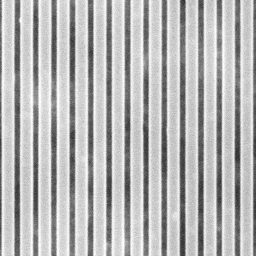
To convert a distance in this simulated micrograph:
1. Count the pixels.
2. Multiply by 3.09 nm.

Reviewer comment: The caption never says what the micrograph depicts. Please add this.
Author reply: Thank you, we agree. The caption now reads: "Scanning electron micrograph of parallel lines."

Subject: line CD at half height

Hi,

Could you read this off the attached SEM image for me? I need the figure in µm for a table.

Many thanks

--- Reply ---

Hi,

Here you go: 0.0355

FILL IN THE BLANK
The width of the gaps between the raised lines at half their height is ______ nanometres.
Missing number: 20.5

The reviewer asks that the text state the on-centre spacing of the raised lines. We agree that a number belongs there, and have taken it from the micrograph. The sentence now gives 0.0567 microns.